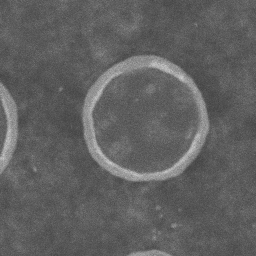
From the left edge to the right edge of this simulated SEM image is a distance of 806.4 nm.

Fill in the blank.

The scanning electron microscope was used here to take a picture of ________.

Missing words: raised bodies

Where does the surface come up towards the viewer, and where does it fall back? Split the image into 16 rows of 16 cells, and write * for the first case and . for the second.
................
................
................
................
.......****.....
......******....
*.....*******...
*....********...
*.....*******...
*.....******....
.......****.....
................
................
................
................
................